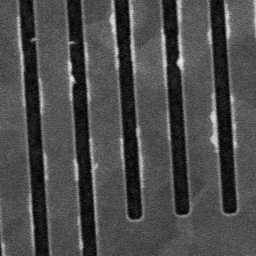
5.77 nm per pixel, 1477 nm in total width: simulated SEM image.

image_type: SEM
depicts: parallel lines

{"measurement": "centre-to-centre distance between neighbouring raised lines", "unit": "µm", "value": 0.274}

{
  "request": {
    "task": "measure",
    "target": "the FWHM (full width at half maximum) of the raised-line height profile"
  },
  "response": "190 nanometers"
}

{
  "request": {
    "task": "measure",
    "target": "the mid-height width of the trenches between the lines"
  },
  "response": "14.6 pixels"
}